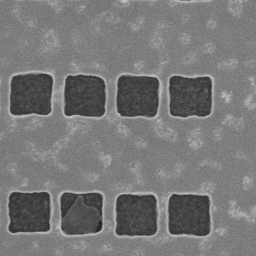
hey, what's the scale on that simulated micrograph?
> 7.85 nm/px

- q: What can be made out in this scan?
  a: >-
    a regular array of holes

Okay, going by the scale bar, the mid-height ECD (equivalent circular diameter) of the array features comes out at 359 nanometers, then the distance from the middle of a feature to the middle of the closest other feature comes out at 414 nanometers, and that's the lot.